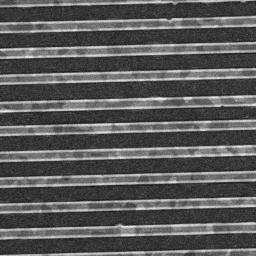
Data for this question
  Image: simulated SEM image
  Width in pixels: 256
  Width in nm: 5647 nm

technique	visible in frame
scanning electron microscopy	parallel lines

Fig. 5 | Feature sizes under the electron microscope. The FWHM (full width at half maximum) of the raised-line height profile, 174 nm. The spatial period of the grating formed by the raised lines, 568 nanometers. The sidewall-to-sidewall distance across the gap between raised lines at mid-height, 0.383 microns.